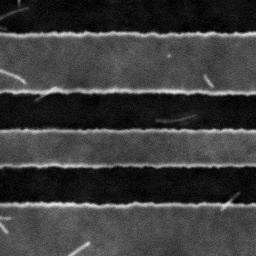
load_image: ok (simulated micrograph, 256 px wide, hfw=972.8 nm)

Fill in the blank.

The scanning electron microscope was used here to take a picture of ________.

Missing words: lines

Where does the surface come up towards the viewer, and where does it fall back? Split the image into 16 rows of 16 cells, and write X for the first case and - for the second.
----------------
----------------
XXXXXXXXXXXXXXXX
XXXXXXXXXXXXXXXX
XXXXXXXXXXXXXXXX
XXXXXXXXXXXXXXXX
----------------
----------------
XXXXXXXXXXXXXXXX
XXXXXXXXXXXXXXXX
----------------
----------------
----------------
XXXXXXXXXXXXXXXX
XXXXXXXXXXXXXXXX
XXXXXXXXXXXXXXXX